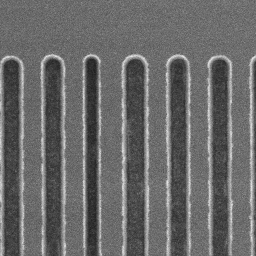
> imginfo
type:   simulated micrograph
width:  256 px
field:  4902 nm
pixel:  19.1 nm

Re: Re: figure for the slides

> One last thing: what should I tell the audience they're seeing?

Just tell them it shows parallel lines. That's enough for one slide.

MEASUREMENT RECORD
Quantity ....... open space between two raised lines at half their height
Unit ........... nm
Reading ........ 347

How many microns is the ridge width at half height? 0.45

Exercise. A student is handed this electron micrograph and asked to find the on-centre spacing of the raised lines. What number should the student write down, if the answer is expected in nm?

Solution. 799